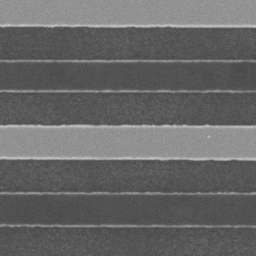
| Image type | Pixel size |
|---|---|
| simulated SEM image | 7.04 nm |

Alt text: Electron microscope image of lines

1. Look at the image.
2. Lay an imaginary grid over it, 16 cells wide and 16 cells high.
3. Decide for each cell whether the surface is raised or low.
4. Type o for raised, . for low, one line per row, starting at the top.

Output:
oooooooooooooooo
oooooooooooooooo
................
................
oooooooooooooooo
oooooooooooooooo
................
................
oooooooooooooooo
oooooooooooooooo
................
................
oooooooooooooooo
oooooooooooooooo
................
................